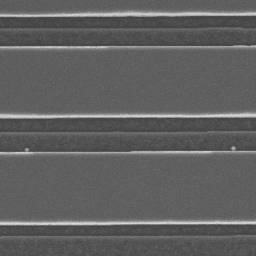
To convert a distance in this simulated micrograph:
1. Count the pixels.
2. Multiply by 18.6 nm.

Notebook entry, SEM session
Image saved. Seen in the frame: lines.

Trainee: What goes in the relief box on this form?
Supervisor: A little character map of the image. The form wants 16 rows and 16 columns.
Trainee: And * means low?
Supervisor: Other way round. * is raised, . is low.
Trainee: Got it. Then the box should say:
****************
................
................
****************
****************
****************
****************
................
................
..........******
****************
****************
****************
****************
................
................